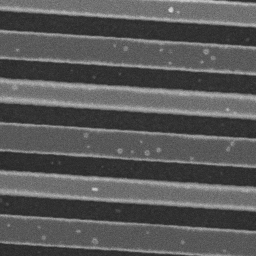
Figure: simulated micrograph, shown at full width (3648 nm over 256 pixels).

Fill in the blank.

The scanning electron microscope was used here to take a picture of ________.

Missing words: lines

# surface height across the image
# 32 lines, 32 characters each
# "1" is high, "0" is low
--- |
11111111111111111111111111111111
00001111111111111111111111111111
00000000000000000011111111111111
00000000000000000000000000000000
11111111111000000000000000000000
11111111111111111111111111100000
11111111111111111111111111111111
00011111111111111111111111111111
00000000000000000011111111111111
00000000000000000000000000000000
11111111100000000000000000000000
11111111111111111111111110000000
11111111111111111111111111111111
00000000000011111111111111111111
00000000000000000000000000111111
11100000000000000000000000000000
11111111111111111110000000000000
11111111111111111111111111111111
11111111111111111111111111111111
00000000011111111111111111111111
00000000000000000000000001111111
11100000000000000000000000000000
11111111111111111000000000000000
11111111111111111111111111111111
00001111111111111111111111111111
00000000000000000001111111111111
00000000000000000000000000000000
11111111110000000000000000000000
11111111111111111111111111000000
11111111111111111111111111111111
01111111111111111111111111111111
00000000000000000111111111111111